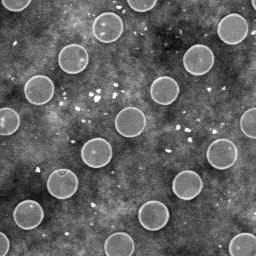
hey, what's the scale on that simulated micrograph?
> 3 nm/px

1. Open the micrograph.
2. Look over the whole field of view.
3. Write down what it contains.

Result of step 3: a regular array of raised bodies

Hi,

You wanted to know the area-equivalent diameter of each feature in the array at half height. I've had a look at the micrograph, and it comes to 88.6 nanometers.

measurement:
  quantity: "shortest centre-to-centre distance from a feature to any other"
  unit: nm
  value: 138